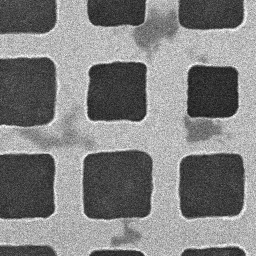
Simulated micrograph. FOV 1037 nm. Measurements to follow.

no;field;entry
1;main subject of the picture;holes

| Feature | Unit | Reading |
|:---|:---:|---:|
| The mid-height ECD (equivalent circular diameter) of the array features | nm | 275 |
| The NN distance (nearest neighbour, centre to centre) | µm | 0.378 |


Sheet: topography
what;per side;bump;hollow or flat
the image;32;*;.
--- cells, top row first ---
.......****.......****.........*
.......****.......****.........*
.......****.......****........**
.......****************......***
********************************
********************************
********************************
......**************************
.......****.......******.....***
.......****.......*****.......**
.......****.......*****.......**
.......****.......*****.......**
.......****.......*****.......**
.......****.......*****.......**
.......****.......******.....***
......**************************
********************************
********************************
********************************
......*****........****.......**
.......****........***........**
.......***.........***.........*
.......***.........***.........*
.......***.........***.........*
.......***.........***.........*
.......***.........***........**
.......****........****.......**
********************************
********************************
********************************
********************************
.......*****.....******.......**